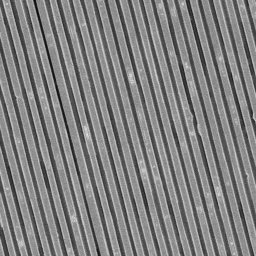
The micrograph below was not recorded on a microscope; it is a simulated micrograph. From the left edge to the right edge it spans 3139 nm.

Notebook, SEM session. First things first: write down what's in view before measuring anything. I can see parallel lines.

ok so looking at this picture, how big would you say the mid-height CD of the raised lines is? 0.0832 µm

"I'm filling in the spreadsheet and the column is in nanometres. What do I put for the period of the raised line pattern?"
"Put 139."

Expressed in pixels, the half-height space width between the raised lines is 4.97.